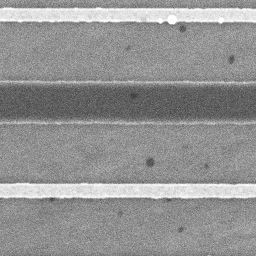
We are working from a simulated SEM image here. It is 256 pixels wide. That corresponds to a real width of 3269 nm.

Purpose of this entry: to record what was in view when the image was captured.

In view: lines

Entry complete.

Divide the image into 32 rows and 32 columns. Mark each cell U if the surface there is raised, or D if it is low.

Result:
DDDDDDDDDDDDDDDDDDDDDDDDDDDDDDDD
UUUUUUUUUUUUUUUUUUUUUUUUUUUUUUUU
DUUUUUUUUUUUUUUUUUUUUUUUUUUUUUUU
DDDDDDDDDDDDDDDDDDDDDDDDDDDDDDDD
DDDDDDDDDDDDDDDDDDDDDDDDDDDDDDDD
DDDDDDDDDDDDDDDDDDDDDDDDDDDDDDDD
DDDDDDDDDDDDDDDDDDDDDDDDDDDDDDDD
DDDDDDDDDDDDDDDDDDDDDDDDDDDDDDDD
DDDDDDDDDDDDDDDDDDDDDDDDDDDDDDDD
DDDDDDDDDDDDDDDDDDDDDDDDDDDDDDDD
UUUUUUUUUUUUUUUUUUUUUUUUUUUUUUUU
UUUUUUUUUUUUUUUUUUUUUUUUUUUUUUUU
UUUUUUUUUUUUUUUUUUUUUUUUUUUUUUUU
UUUUUUUUUUUUUUUUUUUUUUUUUUUUUUUU
UUUUUUUUUUUUUUUUUUUUUUUUUUUUUUUU
DDDDDDDDDDDDDDDDDDDDDDDDDDDDDDDD
DDDDDDDDDDDDDDDDDDDDDDDDDDDDDDDD
DDDDDDDDDDDDDDDDDDDDDDDDDDDDDDDD
DDDDDDDDDDDDDDDDDDDDDDDDDDDDDDDD
DDDDDDDDDDDDDDDDDDDDDDDDDDDDDDDD
DDDDDDDDDDDDDDDDDDDDDDDDDDDDDDDD
DDDDDDDDDDDDDDDDDDDDDDDDDDDDDDDD
DDDDDDDDDDDDDDDDDDDDDDDDDDDDDDDD
UUUUUUUUUUUUUUUUUUUUUUUUUUUUUUUU
UUUUUUUUUUUUUUUUUUUUUUUUUUUUUUUU
DDDDDDDDDDDDDDDDDDDDDDDDDDDDDDDD
DDDDDDDDDDDDDDDDDDDDDDDDDDDDDDDD
DDDDDDDDDDDDDDDDDDDDDDDDDDDDDDDD
DDDDDDDDDDDDDDDDDDDDDDDDDDDDDDDD
DDDDDDDDDDDDDDDDDDDDDDDDDDDDDDDD
DDDDDDDDDDDDDDDDDDDDDDDDDDDDDDDD
DDDDDDDDDDDDDDDDDDDDDDDDDDDDDDDD